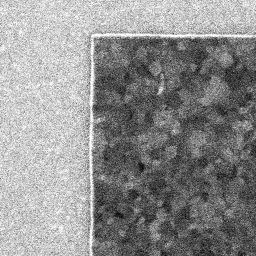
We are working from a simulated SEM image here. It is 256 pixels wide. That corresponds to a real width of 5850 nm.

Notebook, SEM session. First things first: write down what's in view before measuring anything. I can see one or a few lines or trenches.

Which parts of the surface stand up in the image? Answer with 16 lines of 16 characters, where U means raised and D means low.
DDDDDDDDDDDDDDDD
DDDDDDDDDDDDDDDD
DDDDDDUUUUUUUUUU
DDDDDDUUUUUUUUUU
DDDDDDUUUUUUUUUU
DDDDDDUUUUUUUUUU
DDDDDDUUUUUUUUUU
DDDDDDUUUUUUUUUU
DDDDDDUUUUUUUUUU
DDDDDDUUUUUUUUUU
DDDDDDUUUUUUUUUU
DDDDDDUUUUUUUUUU
DDDDDDUUUUUUUUUU
DDDDDDUUUUUUUUUU
DDDDDDUUUUUUUUUU
DDDDDDUUUUUUUUUU